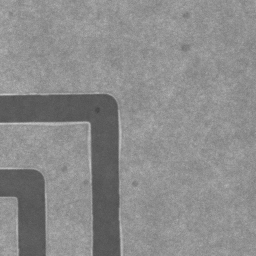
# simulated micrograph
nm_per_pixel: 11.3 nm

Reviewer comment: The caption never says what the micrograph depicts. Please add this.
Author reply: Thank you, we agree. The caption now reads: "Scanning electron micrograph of groups of lines, slits or small figures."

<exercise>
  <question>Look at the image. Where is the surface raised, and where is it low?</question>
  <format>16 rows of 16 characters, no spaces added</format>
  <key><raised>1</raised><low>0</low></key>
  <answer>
1111111111111111
1111111111111111
1111111111111111
1111111111111111
1111111111111111
1111111111111111
0000000111111111
0000000111111111
1111110011111111
1111110011111111
0011110111111111
0001110011111111
1001110011111111
1001110011111111
1001110011111111
1001110011111111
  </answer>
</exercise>